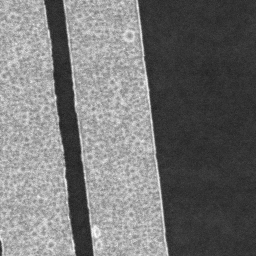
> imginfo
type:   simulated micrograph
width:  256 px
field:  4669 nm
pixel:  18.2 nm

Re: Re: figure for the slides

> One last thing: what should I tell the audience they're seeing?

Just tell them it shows one or a few lines or trenches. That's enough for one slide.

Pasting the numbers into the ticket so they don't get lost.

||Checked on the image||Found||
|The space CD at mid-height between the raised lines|360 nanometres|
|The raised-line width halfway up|1310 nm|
